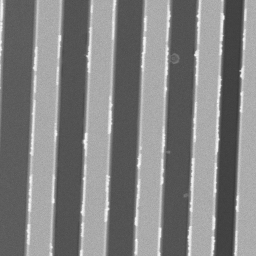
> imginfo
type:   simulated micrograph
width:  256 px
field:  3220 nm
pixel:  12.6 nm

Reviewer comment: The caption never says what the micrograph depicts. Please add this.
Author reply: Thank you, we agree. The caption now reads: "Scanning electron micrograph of parallel lines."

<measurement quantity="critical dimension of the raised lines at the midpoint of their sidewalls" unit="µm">0.347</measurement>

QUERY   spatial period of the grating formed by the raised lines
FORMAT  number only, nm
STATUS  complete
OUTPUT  678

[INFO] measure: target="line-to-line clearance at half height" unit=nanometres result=336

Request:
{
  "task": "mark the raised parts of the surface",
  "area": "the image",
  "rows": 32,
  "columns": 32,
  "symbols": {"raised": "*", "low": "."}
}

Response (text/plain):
.....***...****...***....***..**
....****...****...***....***..**
....****...***....***....***..**
....****...***....***....***..**
....****...***....***....***..**
....****...***....***...****..**
....****...***....***...****..**
....****...***....***...****..**
....****...***....***...****..**
....****...***....***...****..**
....***....***....***...****..**
....***....***....***...****..**
....***....***....***...****..**
....***....***...****...****..**
....***....***...****...****..**
....***....***...****...***...**
....***....***...****...***...**
....***....***...****...***...**
....***...****...****...***...**
....***...****...****...***...**
....***....***...****...***...**
....***...****...****...***...**
....***...****...***....***...**
....***...****...***....***..***
....***...****...***....***..***
...****...****...***....***..***
...****...****...***....***..***
...****...***....***....***..***
...****...***....***....***..***
...****...***....***....***..***
...****...***....***...****..***
...****...***....***...****..***